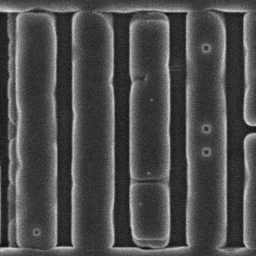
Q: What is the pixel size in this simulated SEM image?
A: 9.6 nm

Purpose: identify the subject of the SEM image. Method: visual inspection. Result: wiring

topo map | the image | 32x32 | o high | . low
oooooooooooooooooooooooooooooooo
..ooooo..ooooo....ooo..oooo...oo
..ooooo..ooooo...oooo..ooooo...o
..ooooo..ooooo..ooooo..ooooo...o
..ooooo..ooooo..ooooo..ooooo...o
..ooooo..ooooo..ooooo..ooooo...o
..ooooo..ooooo..ooooo..ooooo...o
..ooooo..ooooo..ooooo..ooooo...o
..ooooo..ooooo..ooooo...oooo...o
..ooooo..ooooo..ooooo...oooo...o
..ooooo..ooooo..ooooo..ooooo...o
..ooooo..ooooo..ooooo..ooooo...o
..ooooo..ooooo..ooooo..ooooo...o
..ooooo..ooooo..ooooo..ooooo...o
..ooooo..ooooo..ooooo..ooooo...o
..ooooo..ooooo..ooooo..ooooo...o
..ooooo..ooooo..ooooo..ooooo....
..ooooo..ooooo..ooooo..ooooo...o
..ooooo..ooooo..ooooo..ooooo...o
..ooooo..ooooo..ooooo..ooooo...o
..ooooo..ooooo..ooooo..ooooo...o
..ooooo..ooooo..ooooo...oooo...o
..ooooo..ooooo..ooooo...oooo...o
..ooooo..ooooo..ooooo...oooo...o
..ooooo..ooooo..ooooo...oooo...o
..ooooo..ooooo..ooooo..ooooo...o
..ooooo..ooooo..ooooo..ooooo...o
..ooooo..ooooo..ooooo..ooooo...o
..ooooo..ooooo..ooooo..ooooo...o
..ooooo..ooooo...oooo..ooooo...o
..ooooo..ooooo...oooo..ooooo...o
oooooooooooooooooooooooooooooooo